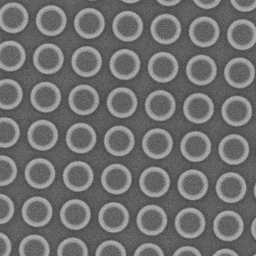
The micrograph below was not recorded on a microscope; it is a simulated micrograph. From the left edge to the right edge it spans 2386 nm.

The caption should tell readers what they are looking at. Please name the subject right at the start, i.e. an array of small figures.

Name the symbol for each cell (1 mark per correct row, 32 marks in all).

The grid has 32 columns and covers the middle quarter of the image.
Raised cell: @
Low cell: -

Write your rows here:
--@@@@@@@---@@@@@@@--@@@@@@@---@
---@@@@@@---@@@@@@@--@@@@@@@---@
----@@@@----@@@@@@---@@@@@@@---@
--------------@@@-----@@@@@----@
-------------------------@------
---@@@--------------------------
--@@@@@@----@@@@@---------------
-@@@@@@@---@@@@@@-----@@@@@-----
-@@@@@@@@--@@@@@@@---@@@@@@----@
-@@@@@@@@--@@@@@@@--@@@@@@@@--@@
--@@@@@@---@@@@@@@--@@@@@@@@--@@
--@@@@@@---@@@@@@@--@@@@@@@@--@@
----@@------@@@@@----@@@@@@---@@
----------------------@@@@-----@
--------------------------------
--@@@@--------------------------
-@@@@@@----@@@@@------@@@-------
-@@@@@@@--@@@@@@@---@@@@@@-----@
-@@@@@@@--@@@@@@@---@@@@@@@---@@
-@@@@@@@--@@@@@@@---@@@@@@@--@@@
-@@@@@@---@@@@@@@---@@@@@@@--@@@
--@@@@@----@@@@@@---@@@@@@@--@@@
------------@@@@-----@@@@@----@@
----------------------@@------@@
--@@@---------------------------
-@@@@@-----@@@@-----------------
@@@@@@@---@@@@@@----@@@@@-------
@@@@@@@---@@@@@@@--@@@@@@@----@@
@@@@@@@--@@@@@@@@--@@@@@@@---@@@
@@@@@@@--@@@@@@@@--@@@@@@@---@@@
-@@@@@----@@@@@@---@@@@@@@---@@@
--@@@------@@@@@----@@@@@@---@@@